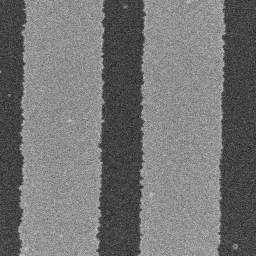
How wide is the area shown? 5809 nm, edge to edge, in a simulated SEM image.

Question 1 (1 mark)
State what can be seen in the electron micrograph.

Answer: one or a few lines or trenches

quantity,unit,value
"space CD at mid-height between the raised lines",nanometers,967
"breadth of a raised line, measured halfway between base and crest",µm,1.76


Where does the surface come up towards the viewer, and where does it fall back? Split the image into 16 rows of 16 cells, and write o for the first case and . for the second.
..oooo...ooooo..
..oooo...ooooo..
..oooo...ooooo..
..oooo...ooooo..
..oooo...ooooo..
..oooo...ooooo..
.ooooo...ooooo..
.ooooo...ooooo..
.ooooo...ooooo..
.ooooo...ooooo..
.ooooo...ooooo..
.ooooo...ooooo..
.ooooo...ooooo..
.ooooo...ooooo..
.ooooo...ooooo..
.ooooo...ooooo..